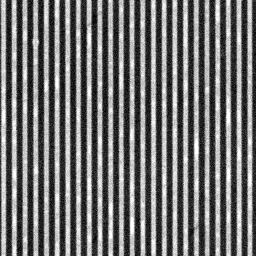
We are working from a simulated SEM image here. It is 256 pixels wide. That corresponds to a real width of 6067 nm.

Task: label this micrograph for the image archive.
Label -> parallel lines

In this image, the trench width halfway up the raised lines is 175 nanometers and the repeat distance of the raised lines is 254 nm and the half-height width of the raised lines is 80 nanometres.